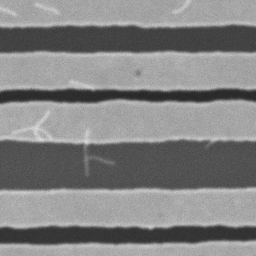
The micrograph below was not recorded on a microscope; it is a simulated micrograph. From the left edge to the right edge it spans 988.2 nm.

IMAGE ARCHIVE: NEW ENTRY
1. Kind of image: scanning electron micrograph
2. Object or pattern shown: lines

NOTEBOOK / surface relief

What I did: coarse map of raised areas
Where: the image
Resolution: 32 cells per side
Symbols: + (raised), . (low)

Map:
++++++++++++++++++++++++++++++++
++++++++++++++++++++++++++++++++
++++++++++++++++++++++++++++++++
................................
................................
................................
................................
++++++++++++++++++++++++++++++++
++++++++++++++++++++++++++++++++
++++++++++++++++++++++++++++++++
++++++++++++++++++++++++++++++++
................................
..............++............+++.
++++++++++++++++++++++++++++++++
++++++++++++++++++++++++++++++++
++++++++++++++++++++++++++++++++
++++++++++++++++++++++++++++++++
..+++++++++++++++++++...++++++++
................................
................................
................................
................................
................................
................................
++++++++++++++++++++++++++++++++
++++++++++++++++++++++++++++++++
++++++++++++++++++++++++++++++++
++++++++++++++++++++++++++++++++
................................
................................
.........+++++.++..+++++++++++++
++++++++++++++++++++++++++++++++